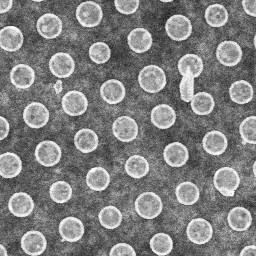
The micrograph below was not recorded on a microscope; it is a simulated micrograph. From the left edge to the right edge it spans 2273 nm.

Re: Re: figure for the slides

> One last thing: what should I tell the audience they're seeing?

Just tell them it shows a regular array of raised bodies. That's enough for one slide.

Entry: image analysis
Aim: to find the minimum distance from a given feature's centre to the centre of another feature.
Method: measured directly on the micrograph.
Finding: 0.353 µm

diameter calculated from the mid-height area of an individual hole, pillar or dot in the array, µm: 0.199